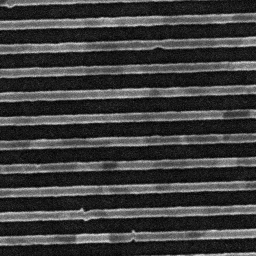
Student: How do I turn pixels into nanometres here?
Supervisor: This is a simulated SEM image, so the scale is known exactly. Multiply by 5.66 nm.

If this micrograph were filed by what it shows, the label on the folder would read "parallel lines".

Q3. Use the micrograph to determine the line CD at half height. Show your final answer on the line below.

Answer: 46.7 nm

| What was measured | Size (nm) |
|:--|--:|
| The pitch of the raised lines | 136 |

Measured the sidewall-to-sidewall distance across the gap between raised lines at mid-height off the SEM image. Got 89.2 nm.